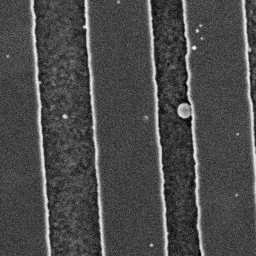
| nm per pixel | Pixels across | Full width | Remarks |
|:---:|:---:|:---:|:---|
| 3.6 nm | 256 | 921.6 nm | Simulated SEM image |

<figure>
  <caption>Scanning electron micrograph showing lines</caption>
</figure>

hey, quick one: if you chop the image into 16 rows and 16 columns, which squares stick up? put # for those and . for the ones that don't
##...####..####.
##...####...###.
##...#####..###.
##....####..###.
##....####..####
##....####..####
###...####..####
###...####..####
###...####..####
###...####..####
###...####..####
###...####..####
###...####..####
###...####..####
###...####..####
###...####...###